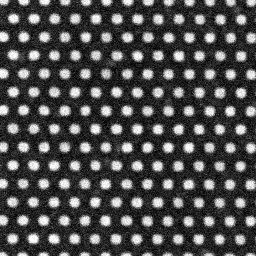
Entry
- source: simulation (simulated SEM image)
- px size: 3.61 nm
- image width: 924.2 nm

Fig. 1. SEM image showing a regular array of raised bodies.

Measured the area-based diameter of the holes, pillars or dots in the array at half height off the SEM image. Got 34.1 nm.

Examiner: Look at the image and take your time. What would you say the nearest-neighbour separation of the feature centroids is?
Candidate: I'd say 74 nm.